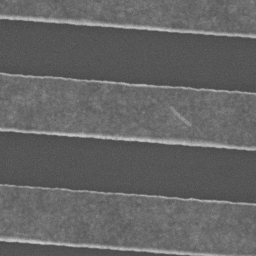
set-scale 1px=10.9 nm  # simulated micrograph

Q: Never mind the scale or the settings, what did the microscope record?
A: lines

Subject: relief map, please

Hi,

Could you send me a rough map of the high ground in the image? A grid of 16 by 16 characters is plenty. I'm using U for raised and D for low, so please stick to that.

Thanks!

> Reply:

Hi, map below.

UUUUUUUUUUUUUUUU
DDDDDUUUUUUUUUUU
DDDDDDDDDDDDDDDD
DDDDDDDDDDDDDDDD
DDDDDDDDDDDDDDDD
UUUUUUUUUUUDDDDD
UUUUUUUUUUUUUUUU
UUUUUUUUUUUUUUUU
DDDDUUUUUUUUUUUU
DDDDDDDDDDDDDDDD
DDDDDDDDDDDDDDDD
DDDDDDDDDDDDDDDD
UUUUUUUUUUUUDDDD
UUUUUUUUUUUUUUUU
UUUUUUUUUUUUUUUU
DDDDDDUUUUUUUUUU